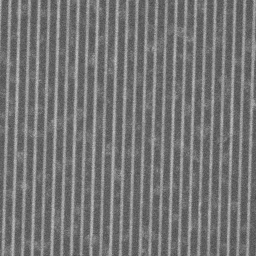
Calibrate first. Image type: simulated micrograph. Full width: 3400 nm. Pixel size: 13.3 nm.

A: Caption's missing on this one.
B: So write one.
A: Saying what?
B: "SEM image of parallel lines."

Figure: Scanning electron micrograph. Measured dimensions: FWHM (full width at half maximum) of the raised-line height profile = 23.2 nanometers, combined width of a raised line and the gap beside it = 0.13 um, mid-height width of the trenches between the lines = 103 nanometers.